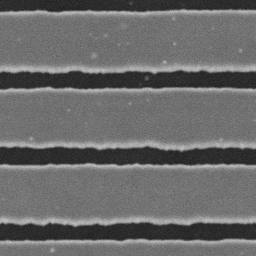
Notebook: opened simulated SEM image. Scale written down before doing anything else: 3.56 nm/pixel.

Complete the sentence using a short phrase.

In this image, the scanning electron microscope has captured lines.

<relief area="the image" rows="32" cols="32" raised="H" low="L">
LLLLLLLLLLLLLLLLLLLLLLLLLLLLLLLL
LHHHHHLLHHHHHHHHHLHHHHHHHHHHHHHH
HHHHHHHHHHHHHHHHHHHHHHHHHHHHHHHH
HHHHHHHHHHHHHHHHHHHHHHHHHHHHHHHH
HHHHHHHHHHHHHHHHHHHHHHHHHHHHHHHH
HHHHHHHHHHHHHHHHHHHHHHHHHHHHHHHH
HHHHHHHHHHHHHHHHHHHHHHHHHHHHHHHH
HHHHHHHHHHHHHHHHHHHHHHHHHHHHHHHH
HHHHHHHHHHHHHHHHHHHHHHHHHHHHHHHH
LLLLLLLLLLLLLLLLLLLLLLLLLLLLLLLL
LLLLLLLLLLLLLLLLLLLLLLLLLLLLLLLL
HHHHHHHHHHHHHHHHHHHHHHHHHHHHHHHH
HHHHHHHHHHHHHHHHHHHHHHHHHHHHHHHH
HHHHHHHHHHHHHHHHHHHHHHHHHHHHHHHH
HHHHHHHHHHHHHHHHHHHHHHHHHHHHHHHH
HHHHHHHHHHHHHHHHHHHHHHHHHHHHHHHH
HHHHHHHHHHHHHHHHHHHHHHHHHHHHHHHH
HHHHHHHHHHHHHHHHHHHHHHHHHHHHHHHH
LLLLHHLLLLHHHHHHLLLLHHHHHHLLLLHH
LLLLLLLLLLLLLLLLLLLLLLLLLLLLLLLL
LLLLLLHLLLHHLLLLLLLLLLLLLLLLLLLL
HHHHHHHHHHHHHHHHHHHHHHHHHHHHHHHH
HHHHHHHHHHHHHHHHHHHHHHHHHHHHHHHH
HHHHHHHHHHHHHHHHHHHHHHHHHHHHHHHH
HHHHHHHHHHHHHHHHHHHHHHHHHHHHHHHH
HHHHHHHHHHHHHHHHHHHHHHHHHHHHHHHH
HHHHHHHHHHHHHHHHHHHHHHHHHHHHHHHH
HHHHHHHHHHHHHHHHHHHHHHHHHHHHHHHH
LLLLLLLLLLLLLLLLLLLLLLLLLLLLLLLL
LLLLLLLLLLLLLLLLLLLLLLLLLLLLLLLL
HHHHHHHHHHHHHHHHHHHHHHHHHHHHHHHH
HHHHHHHHHHHHHHHHHHHHHHHHHHHHHHHH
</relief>